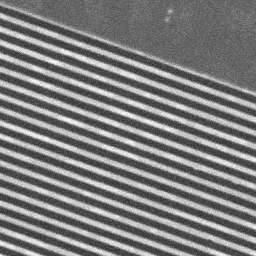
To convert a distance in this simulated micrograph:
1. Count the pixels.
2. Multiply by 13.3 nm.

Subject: parallel lines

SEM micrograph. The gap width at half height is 117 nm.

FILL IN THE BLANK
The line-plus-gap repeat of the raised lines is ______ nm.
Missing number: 167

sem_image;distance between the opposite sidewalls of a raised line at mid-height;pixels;3.53